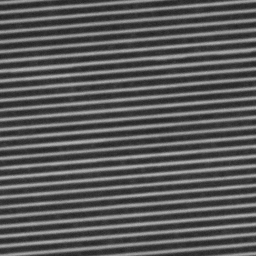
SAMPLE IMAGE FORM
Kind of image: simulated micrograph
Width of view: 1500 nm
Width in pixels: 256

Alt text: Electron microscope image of parallel lines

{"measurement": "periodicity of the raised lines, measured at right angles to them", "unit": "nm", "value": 56.8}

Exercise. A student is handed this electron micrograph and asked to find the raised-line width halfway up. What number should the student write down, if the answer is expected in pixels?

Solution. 2.87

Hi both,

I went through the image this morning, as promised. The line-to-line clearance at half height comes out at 40.1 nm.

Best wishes